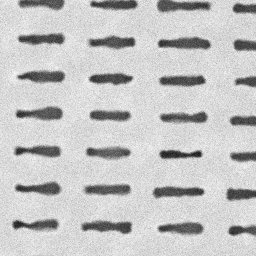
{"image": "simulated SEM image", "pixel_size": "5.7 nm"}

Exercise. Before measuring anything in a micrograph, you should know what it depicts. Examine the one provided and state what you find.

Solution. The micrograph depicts a regular array of holes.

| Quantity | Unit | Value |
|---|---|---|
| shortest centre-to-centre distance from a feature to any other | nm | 211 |